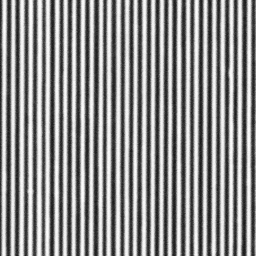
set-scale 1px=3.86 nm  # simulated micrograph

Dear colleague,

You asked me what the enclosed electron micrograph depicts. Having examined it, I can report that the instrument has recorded parallel lines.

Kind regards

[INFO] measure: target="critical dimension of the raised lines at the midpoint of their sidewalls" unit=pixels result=3.37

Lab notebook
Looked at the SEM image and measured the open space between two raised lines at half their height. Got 0.0232 microns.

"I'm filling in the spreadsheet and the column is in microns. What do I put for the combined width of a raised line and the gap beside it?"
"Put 0.0337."